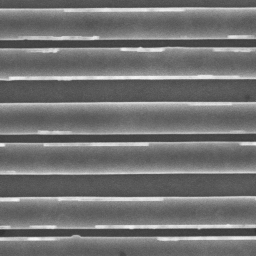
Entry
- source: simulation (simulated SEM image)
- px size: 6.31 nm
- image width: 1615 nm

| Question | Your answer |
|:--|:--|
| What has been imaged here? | parallel lines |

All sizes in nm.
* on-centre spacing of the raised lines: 298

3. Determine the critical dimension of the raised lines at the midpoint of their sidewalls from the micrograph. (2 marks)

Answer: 31.4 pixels